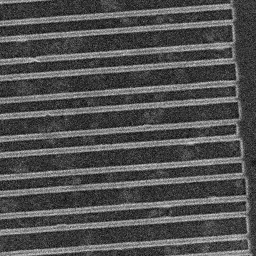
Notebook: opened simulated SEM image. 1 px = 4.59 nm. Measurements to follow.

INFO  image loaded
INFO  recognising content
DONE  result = parallel lines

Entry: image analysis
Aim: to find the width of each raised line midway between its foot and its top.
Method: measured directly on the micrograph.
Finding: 22.9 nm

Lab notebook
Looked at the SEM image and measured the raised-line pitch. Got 88.2 nanometres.